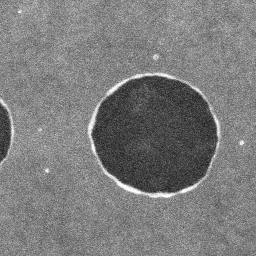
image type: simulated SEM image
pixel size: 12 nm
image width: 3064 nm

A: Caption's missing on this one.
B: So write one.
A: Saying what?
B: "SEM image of holes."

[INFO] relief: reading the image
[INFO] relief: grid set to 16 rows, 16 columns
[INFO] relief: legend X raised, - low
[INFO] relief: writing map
XXXXXXXXXXXXXXXX
XXXXXXXXXXXXXXXX
XXXXXXXXXXXXXXXX
XXXXXXXXXXXXXXXX
XXXXXXXXXXXXXXXX
XXXXXXX-----XXXX
XXXXXX-------XXX
-XXXXX-------XXX
-XXXXX--------XX
-XXXXX-------XXX
XXXXXX-------XXX
XXXXXXXX----XXXX
XXXXXXXXXXXXXXXX
XXXXXXXXXXXXXXXX
XXXXXXXXXXXXXXXX
XXXXXXXXXXXXXXXX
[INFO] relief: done